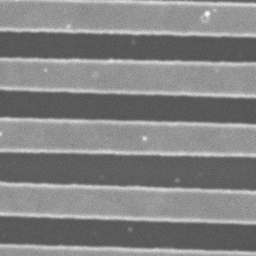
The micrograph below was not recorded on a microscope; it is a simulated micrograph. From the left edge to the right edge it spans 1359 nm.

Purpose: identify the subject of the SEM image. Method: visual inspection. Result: lines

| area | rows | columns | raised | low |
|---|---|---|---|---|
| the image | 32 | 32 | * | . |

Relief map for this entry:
********************************
********************************
********************************
********************************
..........................******
................................
................................
**********......................
********************************
********************************
********************************
........************************
................................
................................
................................
***************************.....
********************************
********************************
********************************
........................********
................................
................................
................................
*******************.............
********************************
********************************
********************************
................****************
................................
................................
................................
******************************..